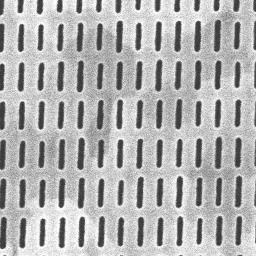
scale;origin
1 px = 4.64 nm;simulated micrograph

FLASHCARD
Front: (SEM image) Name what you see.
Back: a regular array of holes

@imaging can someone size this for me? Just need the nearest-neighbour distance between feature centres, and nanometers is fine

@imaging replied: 90.5